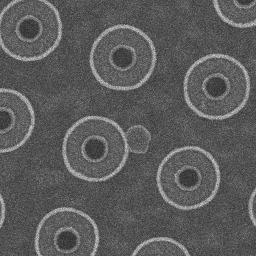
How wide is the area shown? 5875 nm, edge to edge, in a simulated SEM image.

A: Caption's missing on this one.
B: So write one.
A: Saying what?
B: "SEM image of ring-shaped raised bodies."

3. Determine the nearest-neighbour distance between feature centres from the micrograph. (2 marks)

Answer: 2190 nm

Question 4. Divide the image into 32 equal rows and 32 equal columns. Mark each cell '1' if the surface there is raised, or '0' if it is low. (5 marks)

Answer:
01111100000000000000000000011101
11111110000000000000000000011111
11101110000000000000000000001111
11000111000000110000000000000000
11100110000001111100000000000000
11111110000011111110000000000000
01111100000011000110000000000000
00000000000111000110000001111000
00000000000011101110000011111100
00000000000011111110000111111110
00000000000001111100000111001110
11000000000000000000000111001110
11100000000000000000000111111110
11110000000000000000000011111100
00110000000000000000000000110000
01110000001111000000000000000000
11110000011111100000000000000000
11100000111001110000000000000000
11000000110001110000000100000000
00000000111001110000011111000000
00000000111111100000111111100000
00000000011111000000111001100000
00000000000000000000110001100000
00000000000000000000111011100000
00000000000000000000111111100000
00000000000000000000001110000001
00000001110000000000000000000001
00000111111000000000000000000000
00000111111100000000000000000000
00000110001100000000000000000000
00000110001100000011110000000000
00000111111100000111111000000000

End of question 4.